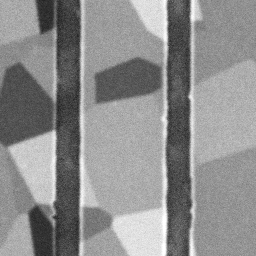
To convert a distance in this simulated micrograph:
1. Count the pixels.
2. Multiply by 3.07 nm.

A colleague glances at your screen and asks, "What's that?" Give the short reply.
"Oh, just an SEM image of one or a few lines or trenches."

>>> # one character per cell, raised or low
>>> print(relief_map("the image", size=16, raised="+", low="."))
+++..+++++..++++
+++..+++++..++++
+++..+++++..++++
+++..+++++..++++
+++..+++++..++++
+++..+++++..++++
+++..+++++..++++
+++..+++++..++++
+++..+++++..++++
+++..+++++..++++
+++..+++++..++++
+++..+++++..++++
+++..+++++..++++
+++..+++++..++++
+++..+++++..++++
+++..+++++..++++